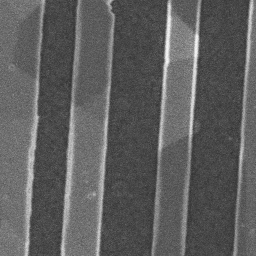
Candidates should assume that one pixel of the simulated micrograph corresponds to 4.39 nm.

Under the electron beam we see one or a few lines or trenches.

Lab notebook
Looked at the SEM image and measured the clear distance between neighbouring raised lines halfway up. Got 218 nm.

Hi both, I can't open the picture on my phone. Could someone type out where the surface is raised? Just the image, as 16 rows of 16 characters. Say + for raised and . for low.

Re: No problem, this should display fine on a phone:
+++..++....+....
+++..++...++....
+++..++...++...+
++...++...+....+
++...++...++...+
++...++...++...+
++..+++...++...+
++..+++...++...+
++..+++...++...+
++..+++...++...+
++..+++...++...+
++..++....++...+
++..++....++...+
++..++....++...+
++..++....++...+
++..++....++...+